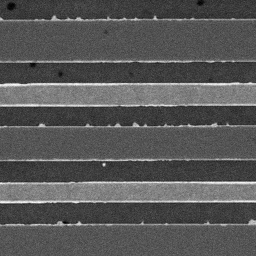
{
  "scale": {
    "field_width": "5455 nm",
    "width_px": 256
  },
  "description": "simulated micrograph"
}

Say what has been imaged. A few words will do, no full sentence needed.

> lines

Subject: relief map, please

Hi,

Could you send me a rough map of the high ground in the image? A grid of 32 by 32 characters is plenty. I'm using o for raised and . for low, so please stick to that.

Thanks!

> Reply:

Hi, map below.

................................
................................
....o.ooo.oooooooooooooooooooooo
oooooooooooooooooooooooooooooooo
oooooooooooooooooooooooooooooooo
oooooooooooooooooooooooooooooooo
oooooooooooooooooooooooooooooooo
oooooooooooooooooooooooooooooooo
................................
................................
..............oooooooooooooooooo
oooooooooooooooooooooooooooooooo
oooooooooooooooooooooooooooooooo
................................
................................
................................
oooooooooooooooooooooooooooooooo
oooooooooooooooooooooooooooooooo
oooooooooooooooooooooooooooooooo
oooooooooooooooooooooooooooooooo
................................
................................
................................
oooooooooooooooooooooooooooooooo
oooooooooooooooooooooooooooooooo
................................
................................
................................
oooooooooooooooooooooooooooooooo
oooooooooooooooooooooooooooooooo
oooooooooooooooooooooooooooooooo
oooooooooooooooooooooooooooooooo